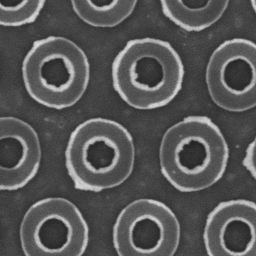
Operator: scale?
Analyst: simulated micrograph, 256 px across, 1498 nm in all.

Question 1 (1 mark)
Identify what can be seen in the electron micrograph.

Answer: ring-shaped raised bodies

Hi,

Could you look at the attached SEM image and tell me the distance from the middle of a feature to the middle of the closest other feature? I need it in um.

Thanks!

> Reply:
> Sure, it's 0.538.